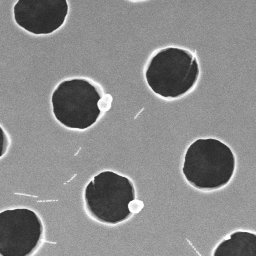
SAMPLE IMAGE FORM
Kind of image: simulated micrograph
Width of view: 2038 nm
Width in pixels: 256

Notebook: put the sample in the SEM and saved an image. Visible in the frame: holes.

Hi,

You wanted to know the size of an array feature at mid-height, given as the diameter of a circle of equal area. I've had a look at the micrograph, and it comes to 0.399 um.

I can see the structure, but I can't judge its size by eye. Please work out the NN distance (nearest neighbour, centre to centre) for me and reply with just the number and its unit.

788 nm